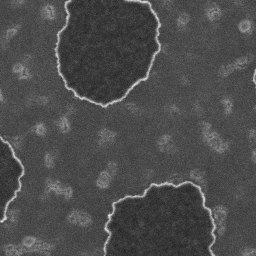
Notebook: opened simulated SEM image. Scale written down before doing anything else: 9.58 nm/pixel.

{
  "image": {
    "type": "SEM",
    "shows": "raised bodies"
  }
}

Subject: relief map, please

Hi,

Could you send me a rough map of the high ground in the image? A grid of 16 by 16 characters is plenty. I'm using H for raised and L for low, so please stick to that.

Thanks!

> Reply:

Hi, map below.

LLLLHHHHHLLLLLLL
LLLLHHHHHHLLLLLL
LLLLHHHHHHLLLLLL
LLLLHHHHHHLLLLLL
LLLLHHHHHLLLLLLL
LLLLHHHHLLLLLLLL
LLLLLLHLLLLLLLLL
LLLLLLLLLLLLLLLL
LLLLLLLLLLLLLLLL
HLLLLLLLLLLLLLLL
HLLLLLLLLLLLLLLL
HLLLLLLLLLLHLLLL
HLLLLLLLHHHHHLLL
LLLLLLLHHHHHHLLL
LLLLLLLHHHHHHLLL
LLLLLLLHHHHHHLLL